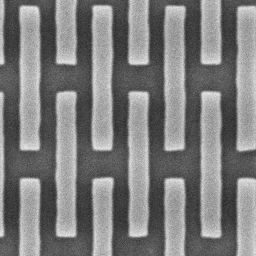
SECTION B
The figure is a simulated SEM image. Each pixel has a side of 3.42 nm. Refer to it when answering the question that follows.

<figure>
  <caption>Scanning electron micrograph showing groups of lines, slits or small figures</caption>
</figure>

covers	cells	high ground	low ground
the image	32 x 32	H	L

LLLLLLLHHLLLLLLLHHLLLLLLLHHLLLLL
LLLHHLLHHLLLHHLLHHLLLHHLLHHLLLHH
LLLHHLLHHLLLHHLLHHLLLHHLLHHLLLHH
LLLHHLLHHLLLHHLLHHHLLHHLLHHLLLHH
LLLHHLLHHLLLHHLLHHHLLHHLLHHHLLHH
LLLHHLLHHLLLHHLLHHHLLHHLLHHHLLHH
LLLHHLLHHLLLHHLLHHLLLHHLLHHHLLHH
LLLHHLLHHLLLHHLLHHLLLHHLLHHLLLHH
LLLHHLLLLLLLHHLLLLLLLHHLLLLLLLHH
LLLHHLLLLLLLHHLLLLLLLHHLLLLLLLHH
LLLHHLLLLLLLHHLLLLLLLHHLLLLLLLHH
LLLHHLLLLLLLHHLLLLLLLHHLLLLLLLHH
LLLHHLLHHLLLHHLLHHLLLHHLLHHLLLHH
LLLHHLLHHLLLHHLLHHLLLHHLLHHLLLHH
LLLHHLLHHLLLHHLLHHLLLHHLLHHHLLHH
LLLHHLLHHLLLHHLLHHLLLHHLLHHHLLHH
LLLHHLLHHLLLHHLLHHLLLHHLLHHLLLHH
LLLHHLLHHLLLHHLLHHLLLHHLLHHLLLHH
LLLHHLLHHLLLHHLLHHLLLHHLLHHLLLHH
LLLLLLLHHLLLLLLLHHLLLLLLLHHLLLLL
LLLLLLLHHLLLLLLLHHLLLLLLLHHLLLLL
LLLLLLLHHLLLLLLLHHLLLLLLLHHLLLLL
LLLHHLLHHLLLHHLLHHHLLHHLLHHHLLHH
LLLHHLLHHLLLHHLLHHHLLHHLLHHHLLHH
LLLHHLLHHLLLHHLLHHLLLHHLLHHHLLHH
LLLHHLLHHLLLHHLLHHLLLHHLLHHLLLHH
LLLHHLLHHLLLHHLLHHHLLHHLLHHLLLHH
LLLHHLLHHLLLHHLLHHLLLHHLLHHLLLHH
LLLHHLLHHLLLHHLLHHLLLHHLLHHHLLHH
LLLHHLLLLLLLHHLLLLLLLHHLLLHLLLHH
LLLHHLLLLLLLHHLLLLLLLHHLLLLLLLHH
LLLHHLLLLLLLHHLLLLLLLHHLLLLLLLHH